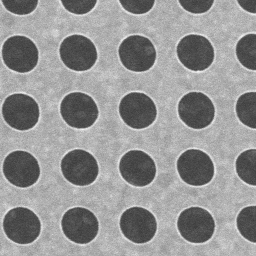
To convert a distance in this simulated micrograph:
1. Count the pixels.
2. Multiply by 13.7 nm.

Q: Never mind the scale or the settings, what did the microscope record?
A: a regular array of holes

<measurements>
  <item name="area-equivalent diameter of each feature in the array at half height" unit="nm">516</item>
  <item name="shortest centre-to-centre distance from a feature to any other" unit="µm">0.783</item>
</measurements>